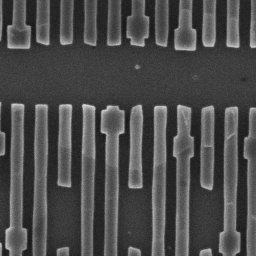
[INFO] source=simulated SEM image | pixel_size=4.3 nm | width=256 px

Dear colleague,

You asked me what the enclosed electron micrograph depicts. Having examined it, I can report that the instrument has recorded wiring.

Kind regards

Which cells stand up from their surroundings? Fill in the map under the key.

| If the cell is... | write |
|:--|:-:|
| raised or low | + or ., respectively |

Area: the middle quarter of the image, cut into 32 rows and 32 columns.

................................
................................
................................
................................
................................
................................
................................
................................
................................
................................
++...++...........+..........+..
++...+++..++++...++....+++..++++
++...+++..+++++..++....+++..++++
++...+++..+++++..++....+++..++++
++...+++.++++++..++....+++..++++
++...+++.++++++..++....++...+++.
++...+++.++++++..++....++...+++.
++...+++...+++...++....++...+++.
++...+++...++....++....++...++++
++...+++...++....++....++..+++++
++...+++...++....++....++..+++++
++...+++...++....++....++..+++++
++...+++...++....++....++..+++++
++...+++...++....++....++...++++
++...+++...++....++....++...+++.
++...+++...++....++...+++...+++.
++...+++...++...+++...+++...+++.
++...+++...++...+++...+++...+++.
++...++....++...+++...+++...+++.
++..+++....++...+++...+++...+++.
.+..+++....++...+++...+++...+++.
....+++....++.........+++...+++.